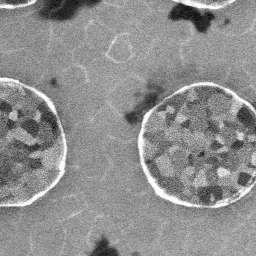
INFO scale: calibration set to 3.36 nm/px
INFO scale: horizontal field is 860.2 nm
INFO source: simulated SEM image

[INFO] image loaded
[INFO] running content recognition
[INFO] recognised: raised bodies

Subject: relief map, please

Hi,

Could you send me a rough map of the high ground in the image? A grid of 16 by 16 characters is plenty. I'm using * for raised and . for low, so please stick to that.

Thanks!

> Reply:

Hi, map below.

................
................
................
................
................
**..........**..
***.......*****.
****.....*******
****.....*******
****.....*******
****.....*******
***.......******
**.........****.
................
................
................